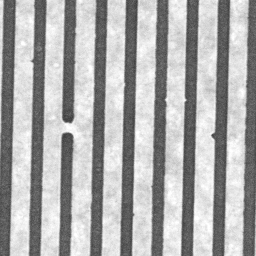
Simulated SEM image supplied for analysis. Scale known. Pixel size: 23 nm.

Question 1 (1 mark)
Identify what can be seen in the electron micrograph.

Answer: parallel lines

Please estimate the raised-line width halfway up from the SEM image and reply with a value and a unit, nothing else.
394 nanometers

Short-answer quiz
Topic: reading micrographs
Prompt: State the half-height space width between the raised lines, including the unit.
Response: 13.4 px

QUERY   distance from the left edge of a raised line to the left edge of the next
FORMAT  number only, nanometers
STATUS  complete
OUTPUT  703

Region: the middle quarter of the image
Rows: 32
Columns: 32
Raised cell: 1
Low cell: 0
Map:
00011110000111100011110000111100
00011110000111100011110000111100
00011110000111100011110000111100
00011110000111100011110000111100
00011110000111100011110000111100
00011110000111100011110000111100
00011110000111100011110000111100
00011110000111100011111000111100
00011110000111100011110000111100
00011110000111100011110000111100
00011110000111100011110000111100
00011110000111100011110000111100
00011110001111100011110000111100
00011110001111100011110000111100
00111110001111000011110000111100
11111110001111000011110000111100
11111110001111000011110000111100
00111110001111000011110000111100
00011110001111000011110000111100
00111110001111000011110000111100
00111110001111000011110000111100
00111110001111000011110000111100
00111110001111000011110000111100
00111110001111000011110000111100
00111110001111000011110000111000
00111110001111000011110000111000
00111110001111000011110000111000
00111110001111000011110000111000
00011110001111000011110000111000
00111110001111000011110000111000
00111110001111000011110000111000
00111110001111000011110000111000